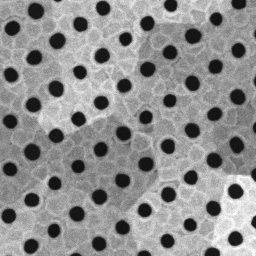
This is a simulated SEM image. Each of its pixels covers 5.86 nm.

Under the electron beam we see a regular array of holes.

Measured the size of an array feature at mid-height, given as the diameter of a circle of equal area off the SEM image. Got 85.4 nanometres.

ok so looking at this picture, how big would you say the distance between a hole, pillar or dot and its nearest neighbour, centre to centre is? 164 nm